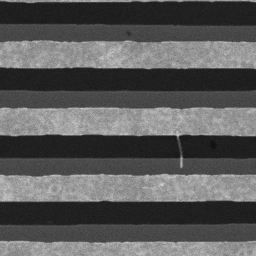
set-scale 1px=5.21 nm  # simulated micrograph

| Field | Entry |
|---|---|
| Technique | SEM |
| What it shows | lines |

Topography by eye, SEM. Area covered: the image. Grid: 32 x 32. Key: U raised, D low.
DDDDDDDDDDDDDDDDDDDDDDDDDDDDDDDD
DDDDDDDDDDDDDDDDDDDDDDDDDDDDDDDD
DDDDDDDDDDDDDDDDDDDDDDDDDDDDDDDD
UUUUUUUUUUUUUUUUUUUUUUUUUUUUUUUU
UUUUUUUUUUUUUUUUUUUUUUUUUUUUUUUU
UUUUUUUUUUUUUUUUUUUUUUUUUUUUUUUU
UUUUUUUUUUUUUUUUUUUUUUUUUUUUUUUU
UUUUUUUUUUUUUUUUUUUUUUUUUUUUUUUU
DDDDDDDDDDDDDDDDDDUDDDUUDDDDDDDU
DDDDDDDDDDDDDDDDDDDDDDDDDDDDDDDD
DDDDDDDDDDDDDDDDDDDDDDDDDDDDDDDD
UUUUUUUUUUUUUUUUUUUUUUUUUUUUUUUU
UUUUUUUUUUUUUUUUUUUUUUUUUUUUUUUU
UUUUUUUUUUUUUUUUUUUUUUUUUUUUUUUU
UUUUUUUUUUUUUUUUUUUUUUUUUUUUUUUU
UUUUUUUUUUUUUUUUUUUUUUUUUUUUUUUU
UUUUUUUUUUUUUUUUUUUUUUUUUUUUUUUU
DDDDDDDDDDDDDDDDDDDDDDDDDDDDDDDD
DDDDDDDDDDDDDDDDDDDDDDDDDDDDDDDD
DDDDDDDDDDDDDDDDDDDDDDDDDDDDDDDD
UUUUUUUUUUUUUUUUUUUUUUUUUUUUUUUU
UUUUUUUUUUUUUUUUUUUUUUUUUUUUUUUU
UUUUUUUUUUUUUUUUUUUUUUUUUUUUUUUU
UUUUUUUUUUUUUUUUUUUUUUUUUUUUUUUU
UUUUUUUUUUUUUUUUUUUUUUUUUUUUUUUU
DDDDDDDDDDDDDDDDDDDDDDDDDDDDDDDD
DDDDDDDDDDDDDDDDDDDDDDDDDDDDDDDD
DDDDDDDDDDDDDDDDDDDDDDDDDDDDDDDD
UUUUUUUUUUUUUUUUUUUUUUUUUUUUUUUU
UUUUUUUUUUUUUUUUUUUUUUUUUUUUUUUU
UUUUUUUUUUUUUUUUUUUUUUUUUUUUUUUU
UUUUUUUUUUUUUUUUUUUUUUUUUUUUUUUU